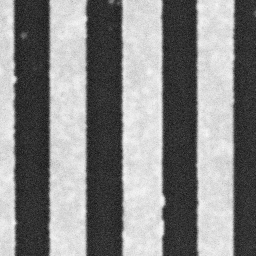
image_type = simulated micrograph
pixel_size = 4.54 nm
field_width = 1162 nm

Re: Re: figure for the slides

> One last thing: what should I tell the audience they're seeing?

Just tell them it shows lines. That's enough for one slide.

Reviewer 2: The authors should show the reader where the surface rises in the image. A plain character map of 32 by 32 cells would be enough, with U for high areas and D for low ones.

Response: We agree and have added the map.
UUDDDDUUUUUDDDDUUUUUDDDDDUUUUDDD
UUDDDDUUUUUDDDDUUUUUDDDDDUUUUDDD
UUDDDDUUUUUDDDDUUUUUDDDDDUUUUDDD
UUDDDDUUUUUDDDDUUUUUDDDDDUUUUDDD
UUDDDDUUUUUDDDDUUUUUDDDDDUUUUDDD
UUDDDDUUUUUDDDDUUUUUDDDDDUUUUDDD
UUDDDDUUUUUDDDDUUUUUDDDDDUUUUDDD
UUDDDDUUUUUDDDDUUUUUDDDDDUUUUDDD
UUDDDDUUUUUDDDDUUUUUDDDDDUUUUDDD
UUDDDDUUUUUDDDDUUUUUDDDDDUUUUDDD
UUDDDDUUUUUDDDDUUUUUDDDDDUUUUDDD
UUDDDDUUUUUDDDDUUUUUDDDDDUUUUDDD
UUDDDDUUUUUDDDDUUUUUDDDDDUUUUDDD
UUDDDDUUUUUDDDDUUUUUDDDDDUUUUDDD
UUDDDDUUUUUDDDDUUUUUDDDDDUUUUDDD
UUDDDDUUUUUDDDDUUUUUDDDDDUUUUDDD
UUDDDDUUUUUDDDDUUUUUDDDDDUUUUDDD
UUDDDDUUUUUDDDDDUUUUDDDDDUUUUDDD
UUDDDDUUUUUDDDDUUUUUDDDDDUUUUDDD
UUDDDDUUUUUDDDDDUUUUDDDDDUUUUDDD
UUDDDDUUUUUDDDDUUUUUDDDDDUUUUDDD
UUDDDDUUUUUDDDDUUUUUDDDDDUUUUDDD
UUDDDDUUUUUDDDDUUUUUDDDDDUUUUDDD
UUDDDDUUUUUDDDDUUUUUDDDDDUUUUDDD
UUDDDDUUUUUDDDDDUUUUDDDDDUUUUDDD
UUDDDDUUUUUDDDDDUUUUDDDDDUUUUDDD
UUDDDDUUUUUDDDDDUUUUDDDDDUUUUDDD
UUDDDDUUUUUDDDDUUUUUDDDDDUUUUDDD
UUDDDDUUUUUDDDDDUUUUDDDDDUUUUDDD
UUDDDDUUUUUDDDDUUUUUDDDDDUUUUDDD
UUDDDDUUUUUDDDDUUUUUDDDDDUUUUDDD
UUDDDDUUUUUDDDDUUUUUDDDDDUUUUDDD